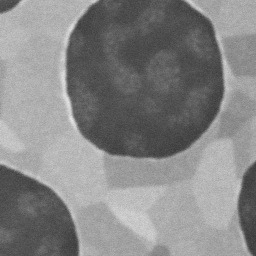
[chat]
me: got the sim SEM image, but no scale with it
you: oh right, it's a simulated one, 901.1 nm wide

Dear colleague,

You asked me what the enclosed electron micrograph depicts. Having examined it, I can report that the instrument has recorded holes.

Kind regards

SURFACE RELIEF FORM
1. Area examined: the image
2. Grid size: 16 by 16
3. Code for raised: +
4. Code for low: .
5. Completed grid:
.++++.......++++
+++++........+++
++++..........++
++++..........++
++++..........++
++++..........++
++++..........++
+++++........+++
+++++........+++
++++++.....+++++
.+++++++++++++++
...++++++++++++.
....+++++++++++.
.....++++++++++.
.....++++++++++.
.....++++++++++.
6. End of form